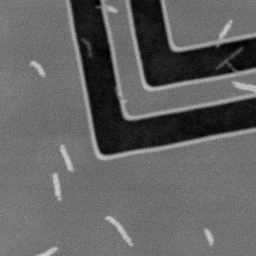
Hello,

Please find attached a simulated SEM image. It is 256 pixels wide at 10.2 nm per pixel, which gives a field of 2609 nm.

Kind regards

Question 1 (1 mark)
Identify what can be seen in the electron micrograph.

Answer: groups of lines, slits or small figures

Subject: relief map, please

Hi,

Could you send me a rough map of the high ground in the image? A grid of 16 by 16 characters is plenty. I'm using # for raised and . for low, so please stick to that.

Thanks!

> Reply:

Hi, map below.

####..##..######
#####..#..######
#####..#...###..
#####..##.......
#####..##......#
#####..#########
#####...#####...
######..........
######.......###
######..########
################
################
################
################
################
################